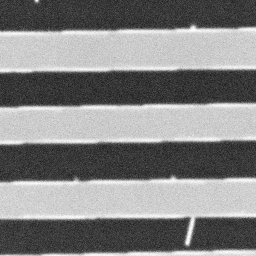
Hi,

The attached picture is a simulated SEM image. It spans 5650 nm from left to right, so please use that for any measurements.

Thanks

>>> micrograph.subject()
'lines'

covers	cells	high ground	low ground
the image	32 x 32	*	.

................................
................................
................................
................................
********************************
********************************
********************************
********************************
********************************
................................
................................
................................
................................
..******************************
********************************
********************************
********************************
****************************....
................................
................................
................................
................................
............................****
********************************
********************************
********************************
********************************
................................
................................
................................
................................
...........................*****